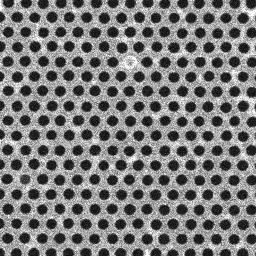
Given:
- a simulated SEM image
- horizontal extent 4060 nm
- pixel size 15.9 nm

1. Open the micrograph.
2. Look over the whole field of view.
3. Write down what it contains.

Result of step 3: a regular array of holes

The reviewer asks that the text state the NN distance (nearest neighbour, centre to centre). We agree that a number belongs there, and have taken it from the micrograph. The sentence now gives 264 nanometres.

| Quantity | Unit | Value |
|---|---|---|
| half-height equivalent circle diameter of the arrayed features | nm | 182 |